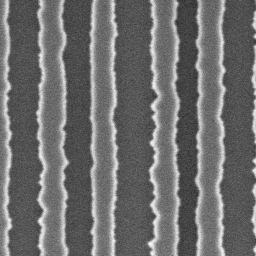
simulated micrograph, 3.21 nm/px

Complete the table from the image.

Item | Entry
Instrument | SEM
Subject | lines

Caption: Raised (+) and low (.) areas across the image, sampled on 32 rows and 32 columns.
+....+++....++.....+++...+++....
+....+++....++.....+++...+++....
+....+++...+++.....+++...+++....
+....+++...+++.....+++...+++....
+....+++...+++.....+++...+++....
+....+++...+++.....+++...+++....
+....+++...+++.....+++...+++....
+....+++...+++.....+++...+++....
+....+++...+++.....+++...+++....
+....+++...+++.....+++...+++....
+....+++...+++.....+++...+++....
+....+++...+++.....+++...+++....
+....+++...+++......++...+++....
+....+++...+++.....+++...+++....
+....+++...+++.....+++...+++....
+....+++....++.....+++...+++....
+....+++....++.....+++...+++....
+....+++....++.....+++...+++....
+....+++...++++....+++...+++....
+....+++....++.....+++...+++....
+....+++....+++....+++...+++....
+....+++...+++.....+++...+++....
+....+++...+++.....+++...+++....
+....+++....++.....+++...++.....
+....+++....++.....+++...+++....
+....+++....++.....+++...+++....
+....+++....++.....+++...+++....
+....+++....++.....+++...+++....
+....+++....++.....+++...+++....
+....+++....++.....+++...+++....
+....+++....++.....+++...+++....
+....+++....++.....+++...+++....